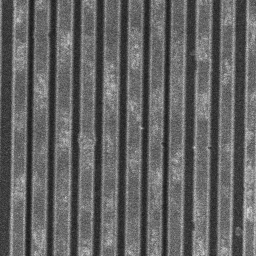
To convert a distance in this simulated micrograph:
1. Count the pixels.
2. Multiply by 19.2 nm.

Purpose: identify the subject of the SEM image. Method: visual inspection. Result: parallel lines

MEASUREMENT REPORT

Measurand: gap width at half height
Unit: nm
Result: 168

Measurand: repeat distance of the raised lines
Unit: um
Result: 0.442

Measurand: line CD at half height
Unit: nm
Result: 279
